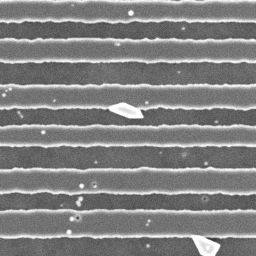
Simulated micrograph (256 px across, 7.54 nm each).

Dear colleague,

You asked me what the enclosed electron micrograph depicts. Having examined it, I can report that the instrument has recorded lines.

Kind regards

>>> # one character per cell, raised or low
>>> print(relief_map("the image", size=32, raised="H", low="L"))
HHHHHHHHHHHHHHHHHHHHHHHHHHHHHHHH
HHHHHHHHHHHHHHHHHHHHHHHHHHHHHHHH
HHHHHHHHHHHHHHHHHHHHHHHHHHHHHHHH
LLLLLLLLLLLLLLLLLLLLLLLLLLLLLLLL
LLLLLLLLLLLLLLLLLLLLLLLLLLLLLLLL
HHHHHHHHHHHHHHHHHHHHHHHHHHHHHHHH
HHHHHHHHHHHHHHHHHHHHHHHHHHHHHHHH
HHHHHHHHHHHHHHHHHHHHHHHHHHHHHHHH
LLLLLLLLLLLLLLLLLLLLLLLLLLLLLLLL
LLLLLLLLLLLLLLLLLLLLLLLLLLLLLLLL
LLLLLLLLLLLLLLLLLLLLLLLLLLLLLLLL
HHHHHHHHHHHHHHHHHHHHHHHHHHHHHHHH
HHHHHHHHHHHHHHHHHHHHHHHHHHHHHHHH
HHHHHLHHHHHHHHHHHHHHHHHHHHHHHHHH
LLLLLLLLLLLLLLLLHHLLLLLLLLLLLLLL
LLLLLLLLLLLLLLLLLLLLLLLLLLLLLLLL
HHHHHHHHHHHHHHHHHHHHHHHHHHHHHHHH
HHHHHHHHHHHHHHHHHHHHHHHHHHHHHHHH
LLLLLLLLLLLLLLLLLLLLLLLLLLLLLLLL
LLLLLLLLLLLLLLLLLLLLLLLLLLLLLLLL
LLLLLLLLLLLLLLLLLLLLLLLLLLLLLLLL
HHHHHHHHHHHHHHHHHHHHHHHHHHHHHHHH
HHHHHHHHHHHHHHHHHHHHHHHHHHHHHHHH
HHHHHHHHHHHHHHHHHHHHHHHHHHHHHHHH
LLLLLLLLLLLLLLLLLLLLLLLLLLLLLLLL
LLLLLLLLLLLLLLLLLLLLLLLLLLLLLLLL
HHHHHHHHHHHHHHHHHHHHHHHHHHHHHHHH
HHHHHHHHHHHHHHHHHHHHHHHHHHHHHHHH
HHHHHHHHHHHHHHHHHHHHHHHHHHHHHHHH
HHHHHHHHHHHHHHHHHHHHHHHHHHHHHHHH
LLLLLLLLLLLLLLLLLLLLLLLLHHHLLLLL
LLLLLLLLLLLLLLLLLLLLLLLLLHHLLLLL